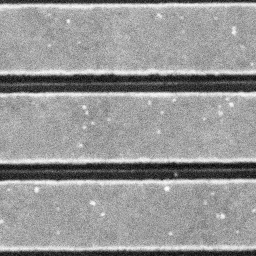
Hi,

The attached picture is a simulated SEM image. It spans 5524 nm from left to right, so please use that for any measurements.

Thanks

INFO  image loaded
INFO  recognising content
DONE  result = lines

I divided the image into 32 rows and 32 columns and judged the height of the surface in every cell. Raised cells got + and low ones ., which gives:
.....................++..+++++++
++++++++++++++++++++++++++++++++
++++++++++++++++++++++++++++++++
++++++++++++++++++++++++++++++++
++++++++++++++++++++++++++++++++
++++++++++++++++++++++++++++++++
++++++++++++++++++++++++++++++++
++++++++++++++++++++++++++++++++
++++++++++++++++++++++++++++++++
................................
................................
................................
++++++++++++++++++++++++++++++++
++++++++++++++++++++++++++++++++
++++++++++++++++++++++++++++++++
++++++++++++++++++++++++++++++++
++++++++++++++++++++++++++++++++
++++++++++++++++++++++++++++++++
++++++++++++++++++++++++++++++++
++++++++++++++++++++++++++++++++
................................
................................
.....................+...+++++++
++++++++++++++++++++++++++++++++
++++++++++++++++++++++++++++++++
++++++++++++++++++++++++++++++++
++++++++++++++++++++++++++++++++
++++++++++++++++++++++++++++++++
++++++++++++++++++++++++++++++++
++++++++++++++++++++++++++++++++
++++++++++++++++++++++++++++++++
................................